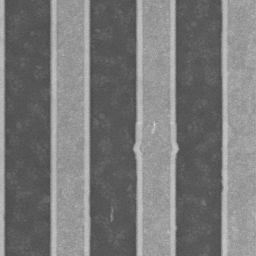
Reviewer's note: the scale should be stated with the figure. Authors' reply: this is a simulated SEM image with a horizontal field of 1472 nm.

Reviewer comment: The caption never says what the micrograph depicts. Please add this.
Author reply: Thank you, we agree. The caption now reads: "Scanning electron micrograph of one or a few lines or trenches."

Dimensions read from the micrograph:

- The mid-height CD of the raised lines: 184 nm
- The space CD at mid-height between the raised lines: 0.305 microns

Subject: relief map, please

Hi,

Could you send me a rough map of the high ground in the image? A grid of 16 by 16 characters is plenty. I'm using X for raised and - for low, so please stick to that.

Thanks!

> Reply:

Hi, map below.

---XX----XX---XX
---XX----XX---XX
---XX----XX---XX
---XX----XX---XX
---XX----XX---XX
---XX----XX---XX
---XX----XX---XX
---XX----XX---XX
---XX----XX---XX
---XX----XX---XX
---XX----XX---XX
---XX----XX---XX
---XX----XX---XX
---XX----XX---XX
---XX----XX---XX
---XX----XX---XX